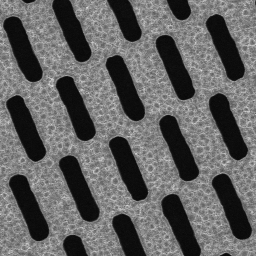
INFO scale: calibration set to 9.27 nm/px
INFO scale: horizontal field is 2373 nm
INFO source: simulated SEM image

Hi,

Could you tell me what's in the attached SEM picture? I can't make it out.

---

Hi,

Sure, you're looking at a regular array of holes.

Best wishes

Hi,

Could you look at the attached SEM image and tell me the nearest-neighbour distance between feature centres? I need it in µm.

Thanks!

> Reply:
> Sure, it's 0.498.